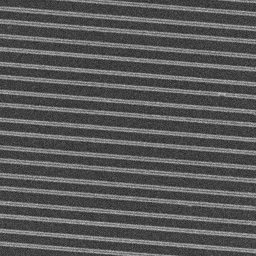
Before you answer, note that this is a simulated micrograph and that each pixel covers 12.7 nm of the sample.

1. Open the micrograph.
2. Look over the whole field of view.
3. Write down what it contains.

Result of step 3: parallel lines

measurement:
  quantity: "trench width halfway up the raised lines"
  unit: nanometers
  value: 133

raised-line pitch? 176 nanometers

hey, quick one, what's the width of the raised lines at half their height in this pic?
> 33.2 nanometres